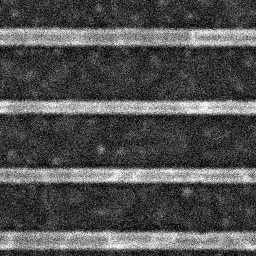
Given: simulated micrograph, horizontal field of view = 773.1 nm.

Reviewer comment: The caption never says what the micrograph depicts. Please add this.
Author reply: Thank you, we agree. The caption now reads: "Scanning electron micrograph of one or a few lines or trenches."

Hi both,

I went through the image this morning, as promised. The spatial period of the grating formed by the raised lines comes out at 205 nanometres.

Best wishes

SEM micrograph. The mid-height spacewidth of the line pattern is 170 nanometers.